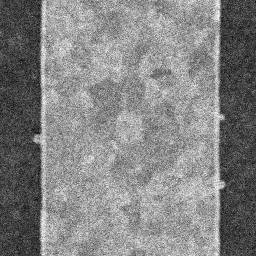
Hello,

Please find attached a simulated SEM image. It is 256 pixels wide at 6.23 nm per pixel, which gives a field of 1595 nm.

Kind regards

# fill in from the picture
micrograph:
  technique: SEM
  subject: one or a few lines or trenches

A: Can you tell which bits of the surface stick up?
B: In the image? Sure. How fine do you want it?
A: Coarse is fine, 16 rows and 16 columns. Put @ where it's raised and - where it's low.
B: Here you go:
---@@@@@@@@@@@--
---@@@@@@@@@@@--
---@@@@@@@@@@@--
---@@@@@@@@@@@--
---@@@@@@@@@@@--
---@@@@@@@@@@@--
---@@@@@@@@@@@--
---@@@@@@@@@@@--
---@@@@@@@@@@@--
---@@@@@@@@@@@--
---@@@@@@@@@@@--
---@@@@@@@@@@@--
---@@@@@@@@@@@--
---@@@@@@@@@@@--
---@@@@@@@@@@@--
---@@@@@@@@@@@--